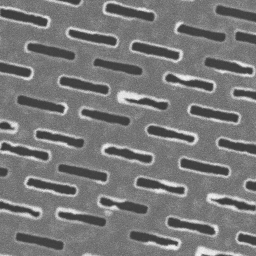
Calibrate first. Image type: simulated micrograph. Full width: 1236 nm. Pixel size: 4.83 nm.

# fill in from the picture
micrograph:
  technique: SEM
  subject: a regular array of holes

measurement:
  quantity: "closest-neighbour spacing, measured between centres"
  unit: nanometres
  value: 192